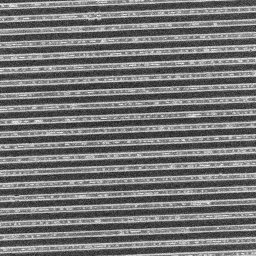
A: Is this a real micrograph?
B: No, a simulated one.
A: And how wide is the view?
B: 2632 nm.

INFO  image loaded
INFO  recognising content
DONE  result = parallel lines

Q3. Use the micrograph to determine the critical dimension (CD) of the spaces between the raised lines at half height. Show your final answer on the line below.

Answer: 80.9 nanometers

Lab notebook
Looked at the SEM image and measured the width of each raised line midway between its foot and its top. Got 53.9 nm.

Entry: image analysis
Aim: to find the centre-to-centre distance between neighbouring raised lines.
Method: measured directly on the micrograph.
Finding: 0.132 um